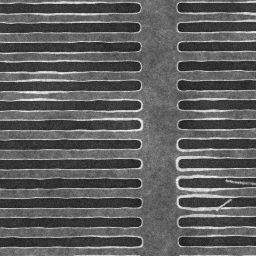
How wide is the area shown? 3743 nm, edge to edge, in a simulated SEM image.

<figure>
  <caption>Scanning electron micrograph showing groups of lines, slits or small figures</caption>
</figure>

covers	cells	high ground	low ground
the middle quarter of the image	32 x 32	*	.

...................*********....
...................**********...
********************************
********************************
...................**********...
...................*********....
...................**********...
********************************
********************************
...................**********...
....................*********...
...................***********..
********************************
********************************
...................**********...
....................*********...
...................************.
********************************
********************************
...................**********...
...................*********....
******************************..
********************************
*****************************...
...................*********....
...................*********....
*****************************..*
********************************
..*..**......****************...
...................*********....
...................**********...
********************************